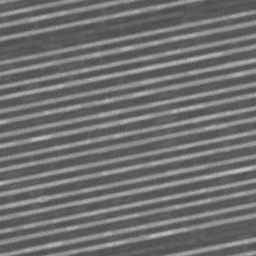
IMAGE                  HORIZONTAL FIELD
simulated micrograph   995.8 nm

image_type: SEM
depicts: parallel lines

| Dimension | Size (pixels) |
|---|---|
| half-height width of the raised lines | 3.8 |